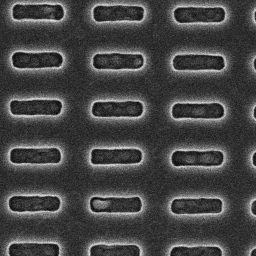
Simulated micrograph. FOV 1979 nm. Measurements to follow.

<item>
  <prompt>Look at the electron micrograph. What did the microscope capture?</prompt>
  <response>a regular array of holes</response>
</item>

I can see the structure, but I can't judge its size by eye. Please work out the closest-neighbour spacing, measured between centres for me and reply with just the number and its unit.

369 nm